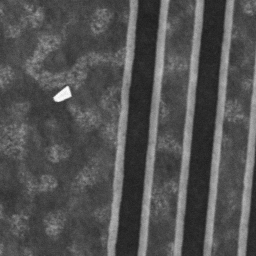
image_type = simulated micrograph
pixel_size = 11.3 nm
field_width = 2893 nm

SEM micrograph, one or a few lines or trenches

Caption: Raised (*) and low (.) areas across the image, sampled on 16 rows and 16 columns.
********..**..**
********..**..**
********..**..**
********..**..**
********..**..**
********..**..**
********..**..**
********..**..**
********..**..**
********.***..**
*******..***.***
*******..**..**.
*******..**..**.
*******..**..**.
*******..**..**.
*******..**..**.